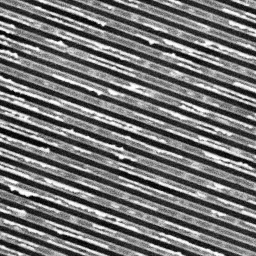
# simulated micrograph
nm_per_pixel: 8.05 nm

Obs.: parallel lines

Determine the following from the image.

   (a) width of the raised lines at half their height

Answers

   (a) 55 nm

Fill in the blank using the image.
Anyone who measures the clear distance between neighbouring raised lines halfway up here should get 48.3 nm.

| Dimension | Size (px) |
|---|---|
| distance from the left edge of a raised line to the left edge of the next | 13.2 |